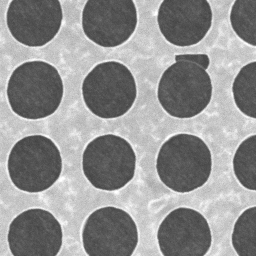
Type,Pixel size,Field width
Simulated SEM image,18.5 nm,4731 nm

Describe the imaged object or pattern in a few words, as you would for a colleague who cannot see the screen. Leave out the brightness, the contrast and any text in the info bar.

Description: holes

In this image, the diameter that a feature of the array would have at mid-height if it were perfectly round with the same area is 1060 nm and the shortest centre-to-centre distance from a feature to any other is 1370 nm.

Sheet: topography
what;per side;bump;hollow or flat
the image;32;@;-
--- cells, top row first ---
@-------@@@------@@@------@@@---
@-------@@-------@@@-------@@---
@-------@@-------@@@-------@@---
@-------@@-------@@@------@@@---
@@-----@@@@-----@@@@------@@@@--
@@@---@@@@@@---@@@@@@----@@@@@@-
@@@@@@@@@@@@@@@@@@@@@@@@@@@@@@@@
@@@@@@@@@@@@@@@@@@@@@@----@@@@@@
@@-----@@@@@----@@@@@-----@@@@--
@-------@@@------@@@------@@@@--
@-------@@-------@@@------@@@---
@-------@@-------@@@-------@@---
@-------@@-------@@@------@@@---
@------@@@@-----@@@@------@@@@--
@@----@@@@@@---@@@@@@@--@@@@@@@-
@@@@@@@@@@@@@@@@@@@@@@@@@@@@@@@@
@@@@@@@@@@@@@@@@@@@@@@@@@@@@@@@@
@@----@@@@@@----@@@@@----@@@@@@-
@@-----@@@@------@@@------@@@@--
@-------@@-------@@@------@@@---
@-------@@-------@@@-------@@---
@-------@@-------@@@------@@@---
@------@@@@-----@@@@------@@@@--
@@----@@@@@@---@@@@@@----@@@@@@-
@@@@@@@@@@@@@@@@@@@@@@@@@@@@@@@@
@@@@@@@@@@@@@@@@@@@@@@@@@@@@@@@@
@@@---@@@@@@----@@@@@----@@@@@--
@@-----@@@@------@@@------@@@@--
@-------@@-------@@@------@@@---
@-------@@-------@@@------@@@---
@-------@@-------@@@------@@@---
@------@@@@------@@@------@@@---